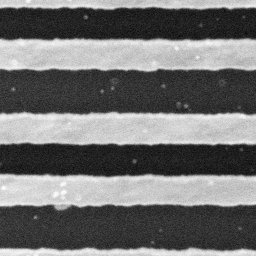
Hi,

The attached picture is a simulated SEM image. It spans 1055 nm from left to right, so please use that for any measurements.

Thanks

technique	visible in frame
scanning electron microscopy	lines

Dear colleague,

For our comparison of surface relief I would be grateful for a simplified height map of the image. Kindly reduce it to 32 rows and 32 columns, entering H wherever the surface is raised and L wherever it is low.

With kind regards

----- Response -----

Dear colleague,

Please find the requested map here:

HHHHHHHHHHHHHHHHHHHHHHHHHHHHHHHH
LLLLLLLLLLLLLLLLLLLLLLLLLLLLLLLL
LLLLLLLLLLLLLLLLLLLLLLLLLLLLLLLL
LLLLLLLLLLLLLLLLLLLLLLLLLLLLLLLL
LLLLLLLLLLLLLLLLLLLLLLLLLLLLLLLL
HHHHHHHHHHHHHHHHHHHHHHHHHHHHHHHH
HHHHHHHHHHHHHHHHHHHHHHHHHHHHHHHH
HHHHHHHHHHHHHHHHHHHHHHHHHHHHHHHH
HHHHHHHHHHHHHHHHHHHHHHHHHHHHLHHH
LLLLLLLLLLLLLLLLLLLLLLLLLLLLLLLL
LLLLLLLLLLLLLLLLLLLLLLLLLLLLLLLL
LLLLLLLLLLLLLLLLLLLLLLLLLLLLLLLL
LLLLLLLLLLLLLLLLLLLLLLLLLLLLLLLL
LLLLLLLLLLLLLLLLLLLLLLLLLLLLLLLL
HHHHHHHHHHHHHHHHHHHHHHHHHHHHHHHH
HHHHHHHHHHHHHHHHHHHHHHHHHHHHHHHH
HHHHHHHHHHHHHHHHHHHHHHHHHHHHHHHH
HHHHHHHHHHHHHHHHHHHHHHHHHHHHHHHH
LLLLLLLLLLLLLLLLLLLLLLLLLLLLLLLL
LLLLLLLLLLLLLLLLLLLLLLLLLLLLLLLL
LLLLLLLLLLLLLLLLLLLLLLLLLLLLLLLL
LLLLLLLLLLLLLLLLLLLLLLLLLLLLLLLL
HHHHHHHHHHHHHHHHHHHHHHHHHHHHHHHH
HHHHHHHHHHHHHHHHHHHHHHHHHHHHHHHH
HHHHHHHHHHHHHHHHHHHHHHHHHHHHHHHH
HHHHHHLHLHHHHHHHHHHLLHHHHHHHHHHH
LLLLLLLLLLLLLLLLLLLLLLLLLLLLLLLL
LLLLLLLLLLLLLLLLLLLLLLLLLLLLLLLL
LLLLLLLLLLLLLLLLLLLLLLLLLLLLLLLL
LLLLLLLLLLLLLLLLLLLLLLLLLLLLLLLL
LLLLLLLLLLLLLLLLLLLLLLLLLLLLLLLL
HHHHHHHHHHHHHHHHHHHHHHHHHHHHHHHH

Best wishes